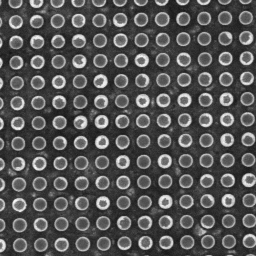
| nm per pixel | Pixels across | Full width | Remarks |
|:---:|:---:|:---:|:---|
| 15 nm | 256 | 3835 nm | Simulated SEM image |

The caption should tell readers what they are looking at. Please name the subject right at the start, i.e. a regular array of raised bodies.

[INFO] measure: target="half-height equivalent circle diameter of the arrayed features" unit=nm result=198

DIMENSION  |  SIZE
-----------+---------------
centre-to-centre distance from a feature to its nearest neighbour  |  303 nm